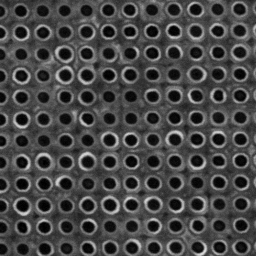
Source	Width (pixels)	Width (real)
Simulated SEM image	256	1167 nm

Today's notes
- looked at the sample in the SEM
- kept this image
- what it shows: a regular array of holes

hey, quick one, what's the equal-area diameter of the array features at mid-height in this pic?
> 54 nm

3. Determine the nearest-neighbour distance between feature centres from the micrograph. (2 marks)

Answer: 97.5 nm